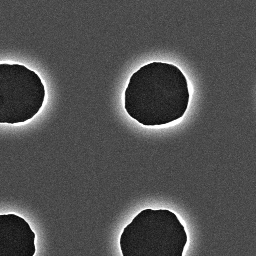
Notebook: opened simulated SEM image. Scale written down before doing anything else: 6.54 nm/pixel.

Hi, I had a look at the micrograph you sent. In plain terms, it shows holes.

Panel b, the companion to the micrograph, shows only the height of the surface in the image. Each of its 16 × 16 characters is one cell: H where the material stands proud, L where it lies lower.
HHHHHHHHHHHHHHHH
HHHHHHHHHHHHHHHH
HHHHHHHHHHHHHHHH
HHHHHHHHHHHHHHHH
LLHHHHHHLLLHHHHH
LLLHHHHHLLLLHHHH
LLLHHHHHLLLLHHHH
LLHHHHHHLLLHHHHH
HHHHHHHHHHHHHHHH
HHHHHHHHHHHHHHHH
HHHHHHHHHHHHHHHH
HHHHHHHHHHHHHHHH
HHHHHHHHHHHHHHHH
LHHHHHHHHLLHHHHH
LLHHHHHHLLLLHHHH
LLHHHHHHLLLLHHHH